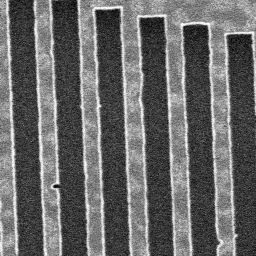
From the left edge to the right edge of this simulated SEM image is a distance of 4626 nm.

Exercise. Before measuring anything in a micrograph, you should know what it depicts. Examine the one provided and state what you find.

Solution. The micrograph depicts parallel lines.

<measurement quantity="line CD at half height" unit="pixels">16.2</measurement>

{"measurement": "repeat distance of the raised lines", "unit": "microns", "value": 0.784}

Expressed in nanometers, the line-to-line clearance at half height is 488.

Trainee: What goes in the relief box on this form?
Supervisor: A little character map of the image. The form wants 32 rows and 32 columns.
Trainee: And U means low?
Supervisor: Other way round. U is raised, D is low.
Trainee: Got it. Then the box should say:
UDDDUUDDDDUUUUUUUUUUUUUUUUUUUUUU
UDDDUUDDDDUUDDDUUUUUUUUUUUUUUUUU
UDDDUUDDDDUUDDDUUDDDDUUUUUUUUUUU
UDDDUUDDDDUUDDDUUDDDDUUDDDUUUUUU
UDDDDUDDDDUUDDDUUDDDDUUDDDUUDDDU
UDDDUUDDDDUUDDDUUDDDDUUDDDUUDDDD
UDDDDUUDDDUUDDDUUDDDDUUDDDUUDDDD
UDDDDUUDDDUUDDDUUUDDDUUDDDUUDDDD
UDDDDUUDDDUUDDDUUUDDDUUDDDUUDDDD
UDDDDUUDDDUUDDDUUUDDDUUDDDUUDDDD
UDDDDUUDDDUUDDDDUUDDDUUDDDUUDDDD
UDDDDUUDDDUUDDDDUUDDDUUDDDUUUDDD
UDDDDUUDDDUUDDDDUUDDDUUDDDDUUDDD
UDDDDUUDDDUUDDDDUUDDDUUDDDDUUDDD
UDDDDUUDDDUUDDDDUUDDDUUDDDDUUDDD
UDDDDUUDDDUUDDDDUUDDDUUDDDDUUDDD
UUDDDUUDDDUUDDDDUUDDDUUDDDDUUDDD
UUDDDUUDDDUUDDDDUUDDDUUDDDDUUDDD
UUDDDUUDDDDUDDDDUUDDDUUDDDDUUDDD
UUDDDUUDDDDUDDDDUUDDDUUDDDDUUDDD
UUDDDUUDDDDUUDDDUUDDDUUDDDDUUDDD
UUDDDUUDDDDUUDDDUUDDDUUDDDDUUDDD
UUDDDUUDDDDUUDDDUUDDDUUUDDDUUDDD
UUDDDUUDDDDUUDDDUUDDDDUUDDDUUDDD
UUDDDUUDDDDUUDDDUUDDDDUUDDDUUDDD
UUDDDUUDDDDUUDDDUUDDDDUUDDDUUDDD
UUDDDUUDDDDUUDDDUUDDDDUUDDDUUDDD
UUDDDUUDDDDUUDDDUUDDDDUUDDDUUDDD
UUDDDDUDDDDUUDDDUUDDDDUUDDDUUDDD
UUDDDDUUDDDUUDDDUUDDDDUUDDDUUDDD
UUDDDDUUDDDUUDDDUUDDDDUUDDDUUDDD
UUDDDDUUDDDUUDDDUUDDDDUUDDDUUDDD